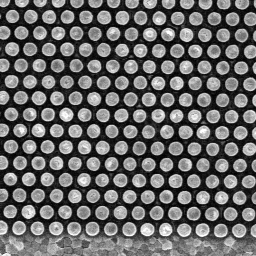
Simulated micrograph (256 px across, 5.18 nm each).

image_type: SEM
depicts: a regular array of raised bodies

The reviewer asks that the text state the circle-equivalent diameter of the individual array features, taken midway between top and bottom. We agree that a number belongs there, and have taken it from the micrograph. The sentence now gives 68.7 nanometers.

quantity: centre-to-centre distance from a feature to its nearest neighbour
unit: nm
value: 93.7